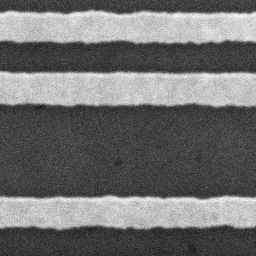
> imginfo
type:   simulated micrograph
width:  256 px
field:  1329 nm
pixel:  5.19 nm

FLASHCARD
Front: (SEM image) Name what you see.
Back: lines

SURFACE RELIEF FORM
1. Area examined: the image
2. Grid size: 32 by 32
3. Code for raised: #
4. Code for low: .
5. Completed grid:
................................
...........#....................
################################
################################
################################
................................
................................
................................
................................
################################
################################
################################
################################
................................
................................
................................
................................
................................
................................
................................
................................
................................
................................
................................
................................
################################
################################
################################
.......##......#.##.............
................................
................................
................................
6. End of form